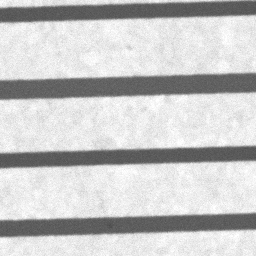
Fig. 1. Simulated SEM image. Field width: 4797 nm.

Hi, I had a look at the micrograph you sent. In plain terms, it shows lines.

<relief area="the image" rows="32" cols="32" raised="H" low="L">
HHHHHHHHHHHLLLLLLLLLLLLLLLLLLLLL
LLLLLLLLLLLLLLLLLLLLLLLLLLLLLLLL
LLLLLLLLLLLLLHHHHHHHHHHHHHHHHHHH
HHHHHHHHHHHHHHHHHHHHHHHHHHHHHHHH
HHHHHHHHHHHHHHHHHHHHHHHHHHHHHHHH
HHHHHHHHHHHHHHHHHHHHHHHHHHHHHHHH
HHHHHHHHHHHHHHHHHHHHHHHHHHHHHHHH
HHHHHHHHHHHHHHHHHHHHHHHHHHHHHHHH
HHHHHHHHHHHHHHHHHHHHHHHHHHHHHHHH
HHHHHHHHHHHHHHHLLLLLLLLLLLLLLLLL
LLLLLLLLLLLLLLLLLLLLLLLLLLLLLLLL
LLLLLLLLLLLLLLLLLLLLLLLLLLLLLLLL
LHHHHHHHHHHHHHHHHHHHHHHHHHHHHHHH
HHHHHHHHHHHHHHHHHHHHHHHHHHHHHHHH
HHHHHHHHHHHHHHHHHHHHHHHHHHHHHHHH
HHHHHHHHHHHHHHHHHHHHHHHHHHHHHHHH
HHHHHHHHHHHHHHHHHHHHHHHHHHHHHHHH
HHHHHHHHHHHHHHHHHHHHHHHHHHHHHHHH
HHHHHHHHHHHHHHHHHHHHHLLLLLLLLLLL
LLLLLLLLLLLLLLLLLLLLLLLLLLLLLLLL
LLLLLLLLLLLLLLLLLLLLLLHHHHHHHHHH
HHHHHHHHHHHHHHHHHHHHHHHHHHHHHHHH
HHHHHHHHHHHHHHHHHHHHHHHHHHHHHHHH
HHHHHHHHHHHHHHHHHHHHHHHHHHHHHHHH
HHHHHHHHHHHHHHHHHHHHHHHHHHHHHHHH
HHHHHHHHHHHHHHHHHHHHHHHHHHHHHHHH
HHHHHHHHHHHHHHHHHHHHHHHHHHHHHHHH
LLLLLLLLLLLLLLLLLLLLLLLLLLLLLLLL
LLLLLLLLLLLLLLLLLLLLLLLLLLLLLLLL
LLLLLLLHHHHHHHHHHHHHHHHHHHHHHHHH
HHHHHHHHHHHHHHHHHHHHHHHHHHHHHHHH
HHHHHHHHHHHHHHHHHHHHHHHHHHHHHHHH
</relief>